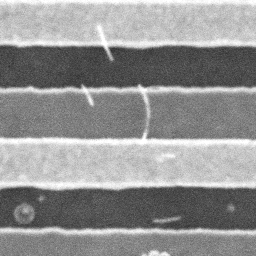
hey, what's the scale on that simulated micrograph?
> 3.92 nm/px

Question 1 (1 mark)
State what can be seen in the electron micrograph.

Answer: lines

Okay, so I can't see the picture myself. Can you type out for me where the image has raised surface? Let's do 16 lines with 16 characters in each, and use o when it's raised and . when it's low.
oooooooooooooooo
oooooooooooooooo
oooooooooooooooo
................
................
................
oooooooooooooooo
oooooooooooooooo
oooooooooooooooo
oooooooooooooooo
oooooooooooooooo
oooooooooooooooo
................
................
ooooooooooooooo.
oooooooooooooooo